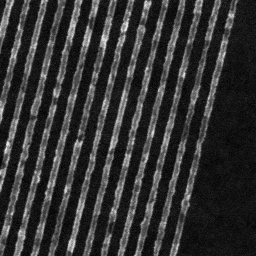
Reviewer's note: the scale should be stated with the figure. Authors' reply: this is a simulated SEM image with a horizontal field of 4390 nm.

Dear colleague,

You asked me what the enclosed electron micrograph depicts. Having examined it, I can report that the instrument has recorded parallel lines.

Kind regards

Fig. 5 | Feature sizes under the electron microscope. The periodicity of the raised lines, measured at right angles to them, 288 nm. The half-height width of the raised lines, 83.3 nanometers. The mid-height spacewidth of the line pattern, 200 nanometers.